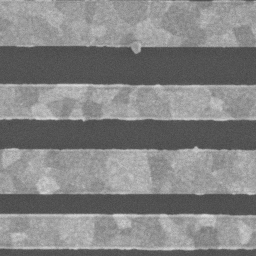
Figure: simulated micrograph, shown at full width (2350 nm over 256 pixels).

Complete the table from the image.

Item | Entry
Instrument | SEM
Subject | lines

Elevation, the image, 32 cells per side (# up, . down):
################################
################################
################################
################################
################################
################################
................................
................................
................................
................................
................................
################################
################################
################################
################################
................................
................................
................................
................................
################################
################################
################################
################################
################################
................................
................................
................................
################################
################################
################################
################################
................................